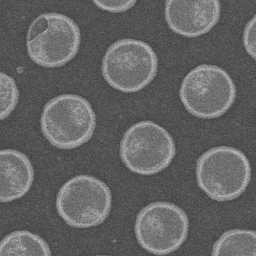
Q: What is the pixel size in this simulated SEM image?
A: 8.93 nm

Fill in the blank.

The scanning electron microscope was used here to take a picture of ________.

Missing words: a regular array of raised bodies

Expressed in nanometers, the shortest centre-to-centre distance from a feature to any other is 725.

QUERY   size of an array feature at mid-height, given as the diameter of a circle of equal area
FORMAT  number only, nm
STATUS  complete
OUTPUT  452